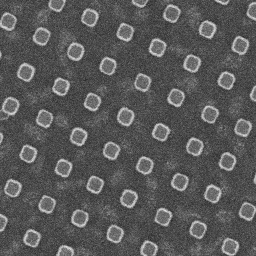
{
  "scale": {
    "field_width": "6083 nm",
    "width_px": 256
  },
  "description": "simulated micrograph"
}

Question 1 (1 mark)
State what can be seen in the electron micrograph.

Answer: a regular array of raised bodies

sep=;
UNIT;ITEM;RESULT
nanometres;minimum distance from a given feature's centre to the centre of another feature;869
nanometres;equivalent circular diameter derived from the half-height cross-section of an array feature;371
